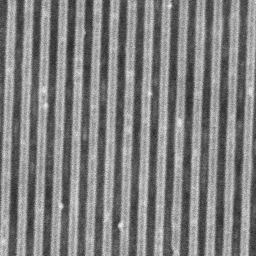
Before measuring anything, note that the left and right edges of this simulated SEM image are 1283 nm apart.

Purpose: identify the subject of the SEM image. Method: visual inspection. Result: parallel lines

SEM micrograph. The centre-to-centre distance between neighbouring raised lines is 86.1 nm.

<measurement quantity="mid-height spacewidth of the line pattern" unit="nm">47.6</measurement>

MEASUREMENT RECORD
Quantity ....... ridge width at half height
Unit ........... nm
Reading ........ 37.6